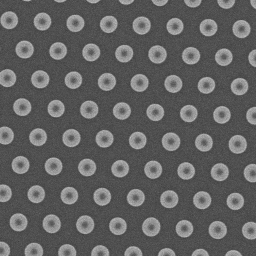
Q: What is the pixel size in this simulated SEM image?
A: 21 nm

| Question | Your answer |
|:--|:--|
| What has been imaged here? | an array of small figures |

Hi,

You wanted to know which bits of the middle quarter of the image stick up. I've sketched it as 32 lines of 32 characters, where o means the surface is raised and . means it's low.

................................
................................
.ooo......oo....................
oooo.....oooo....oooo.....ooo...
oooo.....oooo....oooo....oooo...
.ooo.....oooo....oooo....oooo...
..........o.......oo......ooo...
................................
................................
.....oo.........................
....oooo.....ooo.....ooo......oo
....oooo....ooooo....oooo....ooo
....oooo....oooo.....oooo....ooo
.............ooo.....ooo.....ooo
................................
................................
.oo.............................
oooo....oooo.....ooo.....ooo....
oooo....oooo....oooo.....oooo...
oooo....oooo....oooo.....oooo...
.oo......oo......ooo.....oooo...
..........................oo....
................................
................................
....ooo......oo......oo.........
....oooo....oooo....oooo.....ooo
....oooo....oooo....oooo.....ooo
....ooo.....oooo....oooo.....ooo
.....................oo......ooo
................................
................................
ooo.....ooo......oo.............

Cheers